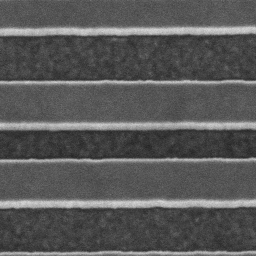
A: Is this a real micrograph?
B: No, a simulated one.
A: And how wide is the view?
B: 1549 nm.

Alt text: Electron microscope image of lines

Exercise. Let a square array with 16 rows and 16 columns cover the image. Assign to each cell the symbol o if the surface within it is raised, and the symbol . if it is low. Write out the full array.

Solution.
oooooooooooooooo
oooooooooooooooo
................
................
................
oooooooooooooooo
oooooooooooooooo
oooooooooooooooo
................
................
oooooooooooooooo
oooooooooooooooo
oooooooooooooooo
................
................
................